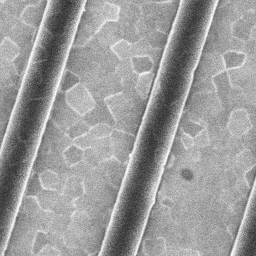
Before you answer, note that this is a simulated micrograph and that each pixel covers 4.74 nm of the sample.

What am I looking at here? one or a few lines or trenches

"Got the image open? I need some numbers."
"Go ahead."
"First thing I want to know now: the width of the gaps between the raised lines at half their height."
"0.43 micrometres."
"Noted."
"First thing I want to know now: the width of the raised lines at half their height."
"167 nm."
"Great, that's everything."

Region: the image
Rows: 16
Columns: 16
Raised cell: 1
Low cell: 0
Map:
0001100000011000
0001100000011000
0011100000011000
0011000000111000
0011000000110000
0111000000110000
0110000001110000
0110000001100000
1110000001100000
1100000011100000
1100000011000000
1100000011000000
1000000111000000
1000000110000001
1000000110000001
0000001110000001